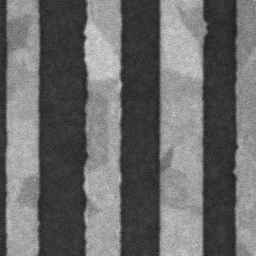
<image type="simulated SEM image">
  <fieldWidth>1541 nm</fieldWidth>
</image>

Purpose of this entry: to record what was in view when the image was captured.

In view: one or a few lines or trenches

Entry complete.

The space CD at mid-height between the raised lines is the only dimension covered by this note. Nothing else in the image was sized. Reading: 41.6 px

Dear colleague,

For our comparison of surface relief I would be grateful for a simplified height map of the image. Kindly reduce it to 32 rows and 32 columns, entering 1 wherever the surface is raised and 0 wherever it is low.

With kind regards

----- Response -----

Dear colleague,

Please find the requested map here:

01111000000111100000111110000011
01111000000111100000111110000011
01111000000111100000111110000011
01111000000111100000111111000011
01111000000111100000111111000011
01111000000111100000111110000011
01111000000111100000111110000011
01111000000111100000111110000011
01111000000111100000111110000011
01111000000111100000111110000011
01111000000111100000111110000011
01111000000111100000111110000011
01111000000111100000111110000011
01111000000111100000111110000011
01111000000111100000111110000011
01111000000111100000111110000011
01111000000111100000111110000011
01111000000111100000111110000011
01111000000111100000111110000011
01111000000111100000111110000011
01111000000111100000111110000011
01111000000111100000111110000111
01111000000111100000111110000011
01111000000111100000111110000011
01111000000111100000111110000011
01111000000111100000111110000011
01111000000111100000111110000011
01111000000111100000111110000011
01111000000111100000111110000011
01111000000111100000111110000011
01111000000111100000111110000011
01111000000111100000111110000011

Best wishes